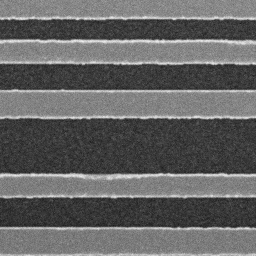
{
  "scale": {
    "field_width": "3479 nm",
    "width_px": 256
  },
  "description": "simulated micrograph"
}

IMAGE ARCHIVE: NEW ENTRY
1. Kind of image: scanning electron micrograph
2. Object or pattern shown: lines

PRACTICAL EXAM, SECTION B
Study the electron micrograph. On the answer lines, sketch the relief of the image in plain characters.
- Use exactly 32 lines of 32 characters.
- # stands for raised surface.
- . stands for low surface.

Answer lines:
################################
################################
................................
................................
................................
################################
################################
################################
................................
................................
................................
################################
################################
################################
################################
................................
................................
................................
................................
................................
................................
................................
################################
################################
################################
................................
................................
................................
######################.#########
################################
################################
################################